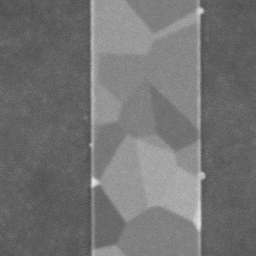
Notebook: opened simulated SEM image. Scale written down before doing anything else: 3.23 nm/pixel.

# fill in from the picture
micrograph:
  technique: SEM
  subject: one or a few lines or trenches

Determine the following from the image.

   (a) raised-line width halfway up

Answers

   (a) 350 nm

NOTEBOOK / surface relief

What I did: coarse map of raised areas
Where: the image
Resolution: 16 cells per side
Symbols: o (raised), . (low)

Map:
......ooooooo...
......oooooo....
......oooooo....
......oooooo....
......oooooo....
......oooooo....
......oooooo....
......oooooo....
......oooooo....
......ooooooo...
......ooooooo...
......ooooooo...
......ooooooo...
......ooooooo...
......oooooo....
......oooooo....